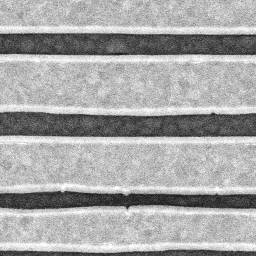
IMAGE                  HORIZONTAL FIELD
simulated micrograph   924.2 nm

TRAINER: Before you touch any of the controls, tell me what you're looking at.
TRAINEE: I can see one or a few lines or trenches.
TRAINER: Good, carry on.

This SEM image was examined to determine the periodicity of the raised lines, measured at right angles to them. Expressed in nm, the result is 261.